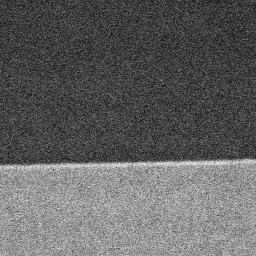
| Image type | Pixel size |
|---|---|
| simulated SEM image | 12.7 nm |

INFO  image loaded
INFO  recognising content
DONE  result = one or a few lines or trenches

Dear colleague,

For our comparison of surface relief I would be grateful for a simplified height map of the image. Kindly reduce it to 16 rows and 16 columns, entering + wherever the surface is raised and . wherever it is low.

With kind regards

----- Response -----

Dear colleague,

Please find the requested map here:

................
................
................
................
................
................
................
................
................
................
++++++++++++++++
++++++++++++++++
++++++++++++++++
++++++++++++++++
++++++++++++++++
++++++++++++++++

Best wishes